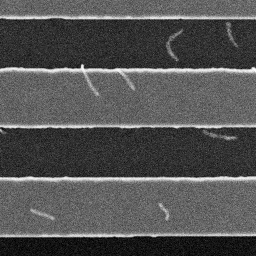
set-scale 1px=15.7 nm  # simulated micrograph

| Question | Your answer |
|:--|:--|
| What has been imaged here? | lines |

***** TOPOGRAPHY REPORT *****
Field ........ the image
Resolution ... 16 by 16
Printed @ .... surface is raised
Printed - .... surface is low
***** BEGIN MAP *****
@@@@@@@@@@@@@@@@
----------------
----------------
----------------
@@@@@@@@@@@@@@@@
@@@@@@@@@@@@@@@@
@@@@@@@@@@@@@@@@
@@@@@@@@@@@@@@@@
----------------
----------------
----------------
@@@@@@@@@@@@@@@@
@@@@@@@@@@@@@@@@
@@@@@@@@@@@@@@@@
@@@@@@@@@@@@@@@@
----------------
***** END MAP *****